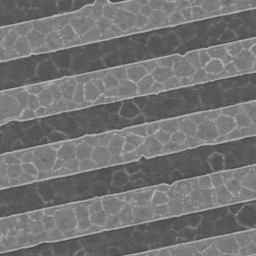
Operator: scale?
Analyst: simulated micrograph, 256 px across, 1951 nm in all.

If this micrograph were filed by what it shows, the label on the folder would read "one or a few lines or trenches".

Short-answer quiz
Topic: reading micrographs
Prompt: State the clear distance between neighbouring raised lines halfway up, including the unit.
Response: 220 nm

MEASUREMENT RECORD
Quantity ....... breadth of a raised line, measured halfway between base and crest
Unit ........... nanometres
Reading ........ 255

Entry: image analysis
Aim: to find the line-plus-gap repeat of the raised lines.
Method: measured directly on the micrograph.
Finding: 474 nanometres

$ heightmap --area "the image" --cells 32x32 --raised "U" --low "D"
DDDDDDDDDDDUUUUUUUUUUUUUUUUUUUUU
DDDDDDDDDUUUUUUUUUUUUUUUUUUUUUDD
DDDDUUUUUUUUUUUUUUUUUUUUUDDDDDDD
UUUUUUUUUUUUUUUUUUUUDDDDDDDDDDDD
UUUUUUUUUUUUUUUDDDDDDDDDDDDDDDDD
UUUUUUUUUUUDDDDDDDDDDDDDDDDDUUUU
UUUUUUDDDDDDDDDDDDDDDDDDUUUUUUUU
UDDDDDDDDDDDDDDDDDDUUUUUUUUUUUUU
DDDDDDDDDDDDDDUUUUUUUUUUUUUUUUUU
DDDDDDDDDUUUUUUUUUUUUUUUUUUUUDDD
DDDDUUUUUUUUUUUUUUUUUUUUUDDDDDDD
UUUUUUUUUUUUUUUUUUUUDDDDDDDDDDDD
UUUUUUUUUUUUUUUDDDDDDDDDDDDDDDDD
UUUUUUUUUUDDDDDDDDDDDDDDDDDDUUUU
UUUUUUDDDDDDDDDDDDDDDDDUUUUUUUUU
DDDDDDDDDDDDDDDDDDUUUUUUUUUUUUUU
DDDDDDDDDDDDDUUUUUUUUUUUUUUUUUUU
DDDDDDDDDUUUUUUUUUUUUUUUUUUUUDDD
DDDDUUUUUUUUUUUUUUUUUUUUDDDDDDDD
UUUUUUUUUUUUUUUUUUUDDDDDDDDDDDDD
UUUUUUUUUUUUUUUDDDDDDDDDDDDDDDDD
UUUUUUUUUUDDDDDDDDDDDDDDDDDUUUUU
UUUUUUDDDDDDDDDDDDDDDDDUUUUUUUUU
UDDDDDDDDDDDDDDDDDUUUUUUUUUUUUUU
DDDDDDDDDDDDDUUUUUUUUUUUUUUUUUUU
DDDDDDDDUUUUUUUUUUUUUUUUUUUUUDDD
DDDDUUUUUUUUUUUUUUUUUUUUDDDDDDDD
UUUUUUUUUUUUUUUUUUUUDDDDDDDDDDDD
UUUUUUUUUUUUUUUDDDDDDDDDDDDDDDDD
UUUUUUUUUUDDDDDDDDDDDDDDDDDDUUUU
UUUUUDDDDDDDDDDDDDDDDDDUUUUUUUUU
UDDDDDDDDDDDDDDDDDUUUUUUUUUUUUUU